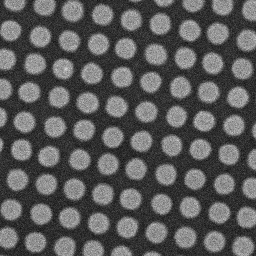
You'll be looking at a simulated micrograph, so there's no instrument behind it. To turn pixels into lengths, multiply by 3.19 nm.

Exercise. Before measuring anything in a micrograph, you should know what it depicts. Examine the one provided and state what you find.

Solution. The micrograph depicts a regular array of raised bodies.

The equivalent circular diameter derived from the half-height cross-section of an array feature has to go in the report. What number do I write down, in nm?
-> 64.5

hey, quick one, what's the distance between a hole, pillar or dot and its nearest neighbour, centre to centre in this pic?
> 91 nanometers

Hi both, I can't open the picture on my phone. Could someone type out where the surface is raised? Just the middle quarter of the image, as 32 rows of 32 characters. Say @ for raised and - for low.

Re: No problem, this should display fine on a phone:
@@----@@---------------------@@@
@@---@@@@----@@@----------------
@@---@@@@@--@@@@@----@@---------
@----@@@@---@@@@@--@@@@@----@@--
------@@----@@@@@--@@@@@---@@@@-
--------------@@---@@@@@---@@@@@
--------------------@@@----@@@@@
@----@@--------------------@@@@-
@---@@@@----@@------------------
@---@@@@---@@@@-----------------
----@@@@---@@@@@---@@@@---------
----@@@@---@@@@@--@@@@@----@@@--
------------@@@---@@@@@---@@@@--
-------------------@@@----@@@@--
----@@@-------------------@@@@--
---@@@@---------------------@---
---@@@@@--@@@@------------------
---@@@@---@@@@@---@@@-----------
----@@@---@@@@@--@@@@@---@@@@---
----------@@@@---@@@@@---@@@@---
-----------@@----@@@@----@@@@---
---@--------------@@@----@@@@--@
--@@@@----@---------------@@----
--@@@@---@@@@-------------------
-@@@@@---@@@@----@@@------------
--@@@@---@@@@---@@@@-----@@-----
---------@@@@---@@@@@--@@@@@----
----------@-----@@@@---@@@@@---@
-----------------@@----@@@@@--@@
-@@@--------------------@@@---@@
@@@@@---@@@--------------------@
@@@@@--@@@@@----@@--------------